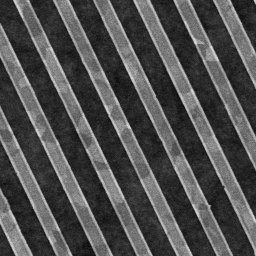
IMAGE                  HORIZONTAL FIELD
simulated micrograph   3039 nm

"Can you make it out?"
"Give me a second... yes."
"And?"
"parallel lines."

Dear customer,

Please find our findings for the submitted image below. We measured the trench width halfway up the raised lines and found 0.282 µm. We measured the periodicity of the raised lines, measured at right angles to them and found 0.428 microns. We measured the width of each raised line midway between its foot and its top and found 12.4 pixels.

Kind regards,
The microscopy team